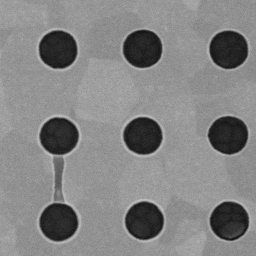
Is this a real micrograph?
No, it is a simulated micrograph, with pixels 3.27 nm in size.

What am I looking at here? holes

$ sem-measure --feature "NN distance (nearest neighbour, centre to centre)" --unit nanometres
278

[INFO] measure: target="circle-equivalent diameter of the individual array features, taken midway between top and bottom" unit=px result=39.8